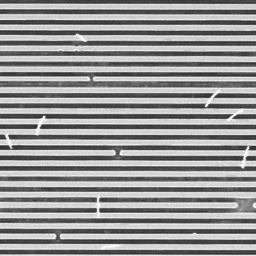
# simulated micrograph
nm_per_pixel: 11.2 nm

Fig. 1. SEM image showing parallel lines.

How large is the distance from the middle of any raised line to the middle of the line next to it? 118 nanometres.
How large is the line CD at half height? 60.5 nm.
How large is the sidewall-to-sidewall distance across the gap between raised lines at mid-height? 0.0492 um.